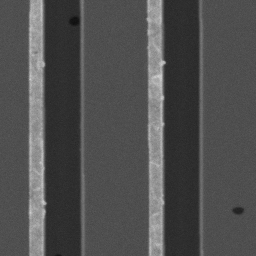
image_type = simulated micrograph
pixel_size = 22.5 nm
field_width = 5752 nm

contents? lines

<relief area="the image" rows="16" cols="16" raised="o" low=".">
ooo..ooooo...ooo
ooo..ooooo...ooo
ooo..ooooo...ooo
ooo..ooooo...ooo
ooo..ooooo...ooo
ooo..ooooo...ooo
ooo..ooooo...ooo
ooo..ooooo...ooo
ooo..ooooo...ooo
ooo..ooooo...ooo
ooo..ooooo...ooo
ooo..ooooo...ooo
ooo..ooooo...ooo
ooo..ooooo...ooo
ooo..ooooo...ooo
ooo..ooooo...ooo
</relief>